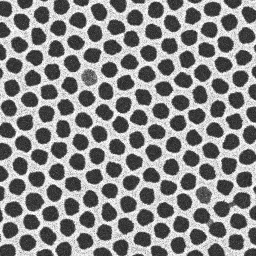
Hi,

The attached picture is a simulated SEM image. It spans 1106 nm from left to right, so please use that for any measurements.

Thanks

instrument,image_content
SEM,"a regular array of holes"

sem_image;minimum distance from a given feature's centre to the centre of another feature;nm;89.6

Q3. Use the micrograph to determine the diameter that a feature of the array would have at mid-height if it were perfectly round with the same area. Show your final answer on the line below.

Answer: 16.6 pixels